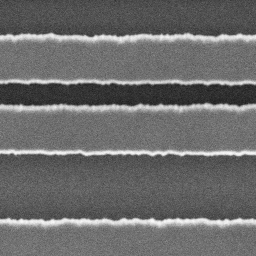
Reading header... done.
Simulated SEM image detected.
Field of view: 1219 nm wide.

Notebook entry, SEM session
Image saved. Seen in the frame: lines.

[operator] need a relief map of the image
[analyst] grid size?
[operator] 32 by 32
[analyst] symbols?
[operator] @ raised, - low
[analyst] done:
--------------------------------
--------------------------------
--------------------------------
--------------------------------
@@@@@@@@@@--@@--@@@@@@@@@--@@@@@
@@@@@@@@@@@@@@@@@@@@@@@@@@@@@@@@
@@@@@@@@@@@@@@@@@@@@@@@@@@@@@@@@
@@@@@@@@@@@@@@@@@@@@@@@@@@@@@@@@
@@@@@@@@@@@@@@@@@@@@@@@@@@@@@@@@
@@@@@@@@@@@@@@@@@@@@@@@@@@@@@@@@
-----------------------@---@@@--
--------------------------------
--------------------------------
@@@@@@@@@@@@@@@@@@@@@@@@@@@@@@@@
@@@@@@@@@@@@@@@@@@@@@@@@@@@@@@@@
@@@@@@@@@@@@@@@@@@@@@@@@@@@@@@@@
@@@@@@@@@@@@@@@@@@@@@@@@@@@@@@@@
@@@@@@@@@@@@@@@@@@@@@@@@@@@@@@@@
@@@@@@@@@@@@@@@@@@@@@@@@@@@@@@@@
--------------------------------
--------------------------------
--------------------------------
--------------------------------
--------------------------------
--------------------------------
--------------------------------
--------------------------------
@@@-@-@@@@@@@@-@@@@--@@@@@---@@@
@@@@@@@@@@@@@@@@@@@@@@@@@@@@@@@@
@@@@@@@@@@@@@@@@@@@@@@@@@@@@@@@@
@@@@@@@@@@@@@@@@@@@@@@@@@@@@@@@@
@@@@@@@@@@@@@@@@@@@@@@@@@@@@@@@@